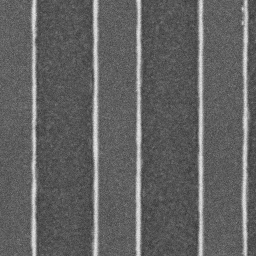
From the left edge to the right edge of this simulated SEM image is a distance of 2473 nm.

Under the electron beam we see one or a few lines or trenches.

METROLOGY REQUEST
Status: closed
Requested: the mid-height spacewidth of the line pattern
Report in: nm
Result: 594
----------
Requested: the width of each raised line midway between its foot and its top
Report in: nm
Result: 423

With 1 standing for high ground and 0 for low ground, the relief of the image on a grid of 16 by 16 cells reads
1100001110000110
1100001110000110
1100001110000110
1100001110000110
1100001110000110
1100001110000110
1100001110000110
1100001110000110
1100001110000110
1100001110000110
1100001110000110
1100001110000110
1100001110000110
1100001110000110
1100001110000110
1100001110000110